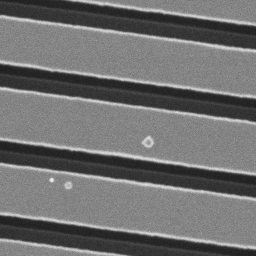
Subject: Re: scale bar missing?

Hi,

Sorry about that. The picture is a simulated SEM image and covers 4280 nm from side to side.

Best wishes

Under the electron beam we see lines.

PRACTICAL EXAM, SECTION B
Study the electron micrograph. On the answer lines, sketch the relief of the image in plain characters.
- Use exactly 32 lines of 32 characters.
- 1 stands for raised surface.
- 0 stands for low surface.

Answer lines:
00000000000011111111111111111111
00000000000000000001111111111111
11111000000000000000000000011111
11111111111100000000000000000000
11111111111111111110000000000000
11111111111111111111111111100000
11111111111111111111111111111111
11111111111111111111111111111111
00001111111111111111111111111111
00000000000111111111111111111111
00000000000000000001111111111111
11111000000000000000000000111111
11111111111100000000000000000000
11111111111111111110000000000000
11111111111111111111111111000000
11111111111111111111111111111111
11111111111111111111111111111111
11111111111111111111111111111111
00000001111111111111111111111111
00000000000000111111111111111111
10000000000000000000011111111111
11111111100000000000000000000111
11111111111111110000000000000000
11111111111111111111110000000000
11111111111111111111111111111100
11111111111111111111111111111111
11111111111111111111111111111111
00000111111111111111111111111111
00000000000011111111111111111111
00000000000000000000111111111111
11111000000000000000000000011111
11111111111100000000000000000000